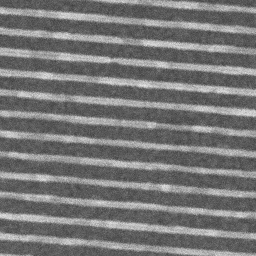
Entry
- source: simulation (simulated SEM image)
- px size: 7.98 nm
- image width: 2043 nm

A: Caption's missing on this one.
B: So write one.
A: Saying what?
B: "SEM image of parallel lines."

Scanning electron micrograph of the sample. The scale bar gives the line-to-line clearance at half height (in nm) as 127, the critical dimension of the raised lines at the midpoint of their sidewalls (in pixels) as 4.49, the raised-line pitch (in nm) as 163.